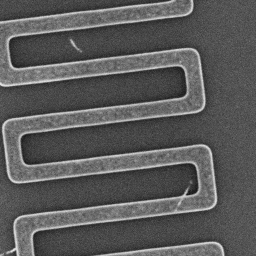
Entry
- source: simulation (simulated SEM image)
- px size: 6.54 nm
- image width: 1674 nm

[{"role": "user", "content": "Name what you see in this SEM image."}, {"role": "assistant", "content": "groups of lines, slits or small figures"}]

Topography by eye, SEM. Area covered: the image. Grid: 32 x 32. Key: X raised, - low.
-------------------XXXXX--------
----------XXXXXXXXXXXXXX--------
--XXXXXXXXXXXXXXXXX-------------
XXXXXXXXXXX---------------------
XX------------------------------
X-------------------------------
X-------------------XXXXX-------
X-----------XXXXXXXXXXXXX-------
XX-XXXXXXXXXXXXXXXX----XX-------
XXXXXXXXXXX------------XX-------
XXX--------------------XX-------
-----------------------XX-------
---------------------XXXX-------
-------------XXXXXXXXXXXX-------
----XXXXXXXXXXXXXXXXX-----------
-XXXXXXXXXXXX-------------------
XXXXX---------------------------
-XX-----------------------------
-XX--------------------XXX------
-XX-----------XXXXXXXXXXXX------
-XX--XXXXXXXXXXXXXXXX---XXX-----
-XXXXXXXXXXXXX-----------XX-----
--XXX--------------------XX-----
-------------------------XX-----
-----------------------XXXX-----
---------------XXXXXXXXXXXX-----
-------XXXXXXXXXXXXXXXX---------
--XXXXXXXXXXXXX-----------------
--XXXXX-------------------------
--XX----------------------------
--XX--------------------XXX-----
--XX------------XXXXXXXXXXXX----